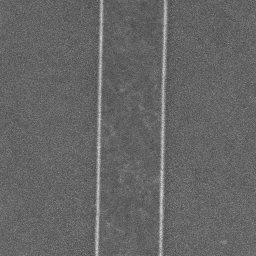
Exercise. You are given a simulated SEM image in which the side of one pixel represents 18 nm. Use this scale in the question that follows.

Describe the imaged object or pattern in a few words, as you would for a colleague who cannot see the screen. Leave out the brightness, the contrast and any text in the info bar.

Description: one or a few lines or trenches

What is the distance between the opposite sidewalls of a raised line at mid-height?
1130 nanometers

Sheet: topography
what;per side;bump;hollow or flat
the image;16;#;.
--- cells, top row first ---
......####......
......####......
......####......
......####......
......####......
......####......
......####......
......####......
......####......
......####......
......####......
......####......
......####......
......####......
......####......
......####......